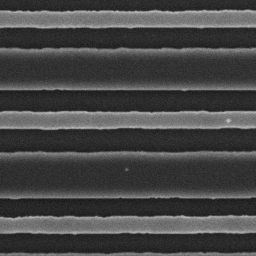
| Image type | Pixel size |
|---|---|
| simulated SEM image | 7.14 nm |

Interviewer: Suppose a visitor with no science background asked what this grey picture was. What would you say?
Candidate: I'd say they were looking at lines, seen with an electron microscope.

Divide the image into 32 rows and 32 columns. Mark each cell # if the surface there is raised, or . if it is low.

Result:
................................
################################
################################
................................
................................
................................
################################
################################
################################
################################
################################
................................
................................
................................
################################
################################
................................
................................
................................
################################
################################
################################
################################
################################
################################
................................
................................
################################
################################
................................
................................
................................